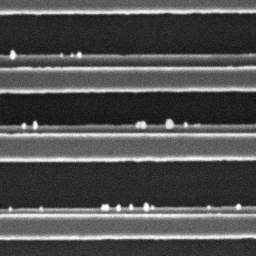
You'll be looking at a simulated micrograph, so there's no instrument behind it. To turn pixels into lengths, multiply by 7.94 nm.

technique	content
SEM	lines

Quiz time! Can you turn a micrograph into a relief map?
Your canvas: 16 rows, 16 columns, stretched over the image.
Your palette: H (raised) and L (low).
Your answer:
HHHHHHHHHHHHHHHH
LLLLLLLLLLLLLLLL
LLLLLLLLLLLLLLLL
HLLHHHLLLLLHHHHH
HHHHHHHHHHHHHHHH
HHHHHHHHHHHHHHHH
LLLLLLLLLLLLLLLL
LLLLLLLLLLLLLLLL
HHHHHHHHHHHHHHHH
HHHHHHHHHHHHHHHH
LLLLLLLLLLLLLLLL
LLLLLLLLLLLLLLLL
LLLLLLLLLLLLLLLL
HHHHHHHHHHHHHHHH
HHHHHHHHHHHHHHHH
LLLLLLLLLLLLLLLL